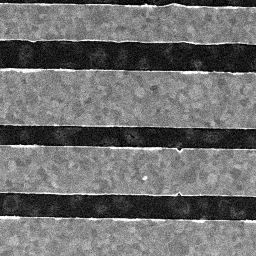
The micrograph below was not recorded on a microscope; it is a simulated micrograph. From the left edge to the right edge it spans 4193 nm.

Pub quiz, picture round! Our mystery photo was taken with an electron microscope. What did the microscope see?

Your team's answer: one or a few lines or trenches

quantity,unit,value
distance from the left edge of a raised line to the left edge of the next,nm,1210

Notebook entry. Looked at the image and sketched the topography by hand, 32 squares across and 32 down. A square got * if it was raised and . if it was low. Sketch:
**..**..........................
********************************
********************************
********************************
********************************
.........................**....*
................................
................................
................................
********************************
********************************
********************************
********************************
********************************
********************************
********************************
................................
................................
****************...*............
********************************
********************************
********************************
********************************
********************************
...............................*
.*..............................
................................
********************............
********************************
********************************
********************************
********************************